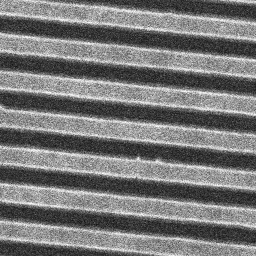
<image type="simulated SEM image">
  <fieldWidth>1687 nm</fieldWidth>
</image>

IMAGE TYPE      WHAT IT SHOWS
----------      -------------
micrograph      parallel lines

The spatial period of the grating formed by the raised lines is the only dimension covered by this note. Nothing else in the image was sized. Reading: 245 nm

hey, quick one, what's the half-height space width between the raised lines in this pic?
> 112 nm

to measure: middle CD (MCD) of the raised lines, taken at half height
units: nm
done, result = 134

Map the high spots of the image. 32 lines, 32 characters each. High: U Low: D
UUUUUUUUUUDDDDDDDDDDDDDDDDDDDDDD
UUUUUUUUUUUUUUUUUUUUDDDDDDDDDDDD
DDDDDDUUUUUUUUUUUUUUUUUUUUUUUUDD
DDDDDDDDDDDDDDDDUUUUUUUUUUUUUUUU
UUUUDDDDDDDDDDDDDDDDDDDDDDUUUUUU
UUUUUUUUUUUUUUDDDDDDDDDDDDDDDDDD
UUUUUUUUUUUUUUUUUUUUUUUDDDDDDDDD
DDDDDDDDDUUUUUUUUUUUUUUUUUUUUUUU
DDDDDDDDDDDDDDDDDDDUUUUUUUUUUUUU
UUUUUUUDDDDDDDDDDDDDDDDDDDDDDUUU
UUUUUUUUUUUUUUUUUDDDDDDDDDDDDDDD
DDDUUUUUUUUUUUUUUUUUUUUUUUDDDDDD
DDDDDDDDDDDDUUUUUUUUUUUUUUUUUUUU
UDDDDDDDDDDDDDDDDDDDDDDUUUUUUUUU
UUUUUUUUUUDDDDDDDDDDDDDDDDDDDDDU
UUUUUUUUUUUUUUUUUUUUDDDDDDDDDDDD
DDDDDDUUUUUUUUUUUUUUUUUUUUUUUDDD
DDDDDDDDDDDDDDDUUUUUUUUUUUUUUUUU
UUUDDDDDDDDDDDDDDDDDDDDDDDUUUUUU
UUUUUUUUUUUUUDDDDDDDDDDDDDDDDDDD
UUUUUUUUUUUUUUUUUUUUUUUDDDDDDDDD
DDDDDDDDUUUUUUUUUUUUUUUUUUUUUUUU
DDDDDDDDDDDDDDDDDDUUUUUUUUUUUUUU
UUUUUUUDDDDDDDDDDDDDDDDDDDDDDUUU
UUUUUUUUUUUUUUUUUDDDDDDDDDDDDDDD
DDUUUUUUUUUUUUUUUUUUUUUUUUDDDDDD
DDDDDDDDDDDDUUUUUUUUUUUUUUUUUUUU
DDDDDDDDDDDDDDDDDDDDDDUUUUUUUUUU
UUUUUUUUUUDDDDDDDDDDDDDDDDDDDDDU
UUUUUUUUUUUUUUUUUUUUDDDDDDDDDDDD
DDDDDUUUUUUUUUUUUUUUUUUUUUUUUUDD
DDDDDDDDDDDDDDDDUUUUUUUUUUUUUUUU